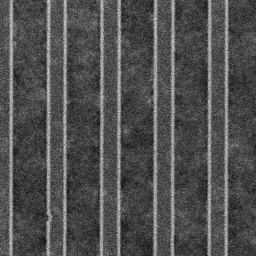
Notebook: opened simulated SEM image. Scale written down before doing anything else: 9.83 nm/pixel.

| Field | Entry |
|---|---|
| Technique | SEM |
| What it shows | parallel lines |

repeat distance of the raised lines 528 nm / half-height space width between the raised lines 356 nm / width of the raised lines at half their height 171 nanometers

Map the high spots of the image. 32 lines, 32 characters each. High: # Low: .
#.....##.....##....###....##....
#.....##.....##....###....##....
#.....##.....##....###....##....
#.....##.....##....###....##....
#.....##.....##....###....##....
#.....##.....##....###....##....
#.....##.....##....###....##....
#.....##.....##....###....##....
#.....##.....##....###....##....
#.....##.....##....###....##....
#.....##.....##....###....##....
#.....##.....##....###....##....
#.....##.....##....###....##....
#.....##.....##....###....##....
#.....##.....##....###....##....
#.....##.....##....###....##....
#.....##.....##....###....##....
#.....##.....##....###....##....
#.....##.....##....###....##....
#.....##.....##....###....##....
#.....##.....##....###....##....
#.....##.....##....###....##....
#.....##.....##....###....##....
#.....##.....##....###....##....
#.....##.....##....###....##....
#.....##.....##....###....##....
#.....##.....##....###....##....
#.....##.....##....###....##....
#.....##.....##....###....##....
#.....##.....##....###....##....
#.....##.....##....###....##....
#.....##.....##....###....##....